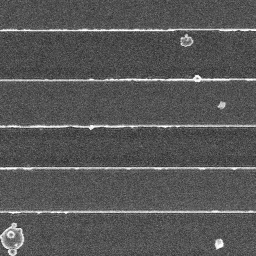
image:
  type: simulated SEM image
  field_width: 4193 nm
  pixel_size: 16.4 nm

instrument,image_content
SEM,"lines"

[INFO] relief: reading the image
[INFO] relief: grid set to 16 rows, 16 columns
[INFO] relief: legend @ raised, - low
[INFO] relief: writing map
@@@@@@@@@@@@@@@@
@@@@@@@@@@@@@@@@
----------------
----------------
----------------
@@@@@@@@@@@@@@@@
@@@@@@@@@@@@@@@@
@@@@@@@@@@@@@@@@
----------------
----------------
----------------
@@@@@@@@@@@@@@@@
@@@@@@@@@@@@@@@@
----------------
----------------
----------------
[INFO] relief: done